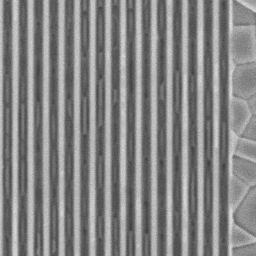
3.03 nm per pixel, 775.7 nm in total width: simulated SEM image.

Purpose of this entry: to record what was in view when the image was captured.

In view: parallel lines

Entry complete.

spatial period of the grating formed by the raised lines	46.8	nm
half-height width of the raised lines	16.3	nm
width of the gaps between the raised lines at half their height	9.87	pixels